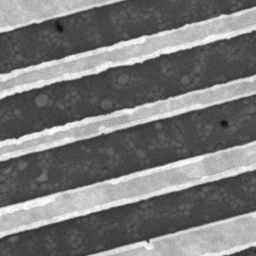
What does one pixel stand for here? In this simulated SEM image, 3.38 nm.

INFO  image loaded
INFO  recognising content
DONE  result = one or a few lines or trenches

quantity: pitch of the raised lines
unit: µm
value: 0.224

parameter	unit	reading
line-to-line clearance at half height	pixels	44.9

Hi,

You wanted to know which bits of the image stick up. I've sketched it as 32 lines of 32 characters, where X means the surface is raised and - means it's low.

XXXXXXXXXXXXX-------------------
XXXXXXXXX---------------------XX
XXXXXX--------------------XXXXXX
XX---------------------XXXXXXXXX
-------------------XXXXXXXXXX---
---------------XXXXXXXXXX-------
-----------XXXXXXXXXX-----------
-------XXXXXXXXXXX--------------
----XXXXXXXXX-------------------
XXXXXXXXXX----------------------
XXXXXX----------------------XXXX
XX----------------------XXXXXXXX
---------------------XXXXXXXX---
-----------------XXXXXXXX-------
-------------XXXXXXXX-----------
---------XXXXXXXX---------------
-----XXXXXXXX-------------------
--XXXXXXXX----------------------
XXXXXX-----------------------XXX
XX------------------------XXXXXX
---------------------XXXXXXXXXXX
------------------XXXXXXXXXXXX--
--------------XXXXXXXXXXXX------
----------XXXXXXXXXXXXX---------
-------XXXXXXXXXXXX-------------
---XXXXXXXXXXXX-----------------
XXXXXXXXXXXX--------------------
XXXXXXXX--------------------XXXX
XXXX---------------------XXXXXXX
---------------------XXXXXXXXXXX
-----------------XXXXXXXXXXXXXXX
-------------XXXXXXXXXXXXXXXX---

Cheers